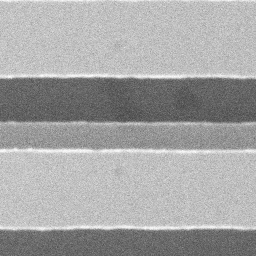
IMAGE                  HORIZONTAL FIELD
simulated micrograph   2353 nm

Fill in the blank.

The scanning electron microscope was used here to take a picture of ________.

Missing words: lines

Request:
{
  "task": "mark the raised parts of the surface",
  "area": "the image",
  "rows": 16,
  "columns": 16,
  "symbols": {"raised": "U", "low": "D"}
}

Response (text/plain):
UUUUUUUUUUUUUUUU
UUUUUUUUUUUUUUUU
UUUUUUUUUUUUUUUU
UUUUUUUUUUUUUUUU
UUUUUUUUUUUUUUUU
DDDDDDDDDDDDDDDD
DDDDDDDDDDDDDDDD
DDDDDDDDDDDDDDDD
UUUUUUUUUUUUUUUU
UUUUUUUUUUUUUUUU
UUUUUUUUUUUUUUUU
UUUUUUUUUUUUUUUU
UUUUUUUUUUUUUUUU
UUUUUUUUUUUUUUUU
DDDDDDDDDDDDDDDD
DDDDDDDDDDDDDDDD